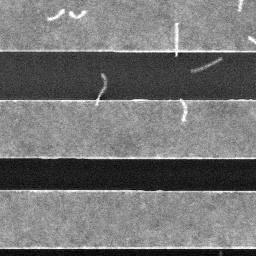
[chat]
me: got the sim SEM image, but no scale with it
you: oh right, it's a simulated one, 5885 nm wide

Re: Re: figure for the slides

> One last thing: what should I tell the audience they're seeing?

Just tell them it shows lines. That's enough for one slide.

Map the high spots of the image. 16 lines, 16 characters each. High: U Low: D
UUUUUUUUUUUUUUUU
UUUUUUUUUUUUUUUU
UUUUUUUUUUUUUUUU
DDDDDDDDDDDDDDDD
DDDDDDDDDDDDDDDD
DDDDDDDDDDDDDDDD
UUUUUUUUUUUUUUUU
UUUUUUUUUUUUUUUU
UUUUUUUUUUUUUUUU
UUUUUUUUUUUUUUUU
DDDDDDDDDDDDDDDD
DDDDDDDDDDDDDDDD
UUUUUUUUUUUUUUUU
UUUUUUUUUUUUUUUU
UUUUUUUUUUUUUUUU
UUUUUUUUUUUUUUUU